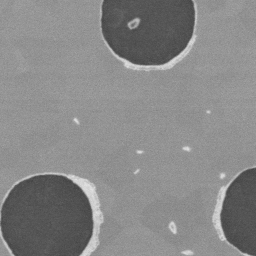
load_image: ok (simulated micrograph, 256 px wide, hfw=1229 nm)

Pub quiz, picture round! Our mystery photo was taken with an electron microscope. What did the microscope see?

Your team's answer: holes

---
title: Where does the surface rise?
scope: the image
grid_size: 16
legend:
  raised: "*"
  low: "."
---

******......****
******......****
*******.....****
*******....*****
****************
****************
****************
****************
****************
****************
****************
*....*********..
......********..
......********..
......********..
*....**********.